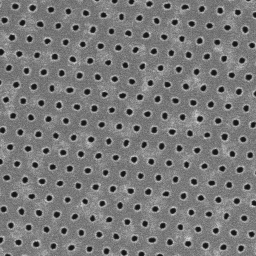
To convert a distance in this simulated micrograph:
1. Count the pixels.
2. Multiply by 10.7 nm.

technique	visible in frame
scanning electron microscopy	a regular array of holes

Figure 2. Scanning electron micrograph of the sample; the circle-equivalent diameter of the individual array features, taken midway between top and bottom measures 5.98 pixels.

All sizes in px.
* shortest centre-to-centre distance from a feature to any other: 17.4